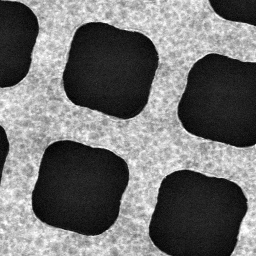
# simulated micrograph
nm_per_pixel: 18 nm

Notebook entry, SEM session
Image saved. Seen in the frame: holes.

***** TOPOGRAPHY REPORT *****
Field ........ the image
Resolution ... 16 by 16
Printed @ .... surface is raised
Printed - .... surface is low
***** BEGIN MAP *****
--@@@@@@@@@@@---
--@@@--@@@@@@@@-
--@@@----@@@@@@@
--@@------@@@-@@
--@@------@@----
@@@@------@@----
@@@@@----@@-----
@@@@@@@@@@@-----
@@@@@@@@@@@@----
-@@----@@@@@@@@@
@@------@@@@@@@@
@@------@@-----@
@@------@@-----@
@@-----@@------@
@@@@@--@@------@
@@@@@@@@@@-----@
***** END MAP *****